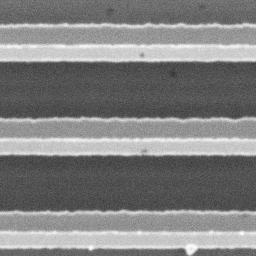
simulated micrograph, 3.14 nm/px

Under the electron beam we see lines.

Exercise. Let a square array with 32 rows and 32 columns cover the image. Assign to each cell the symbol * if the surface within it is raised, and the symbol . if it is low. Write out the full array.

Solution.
................................
................................
................................
********************************
********************************
********************************
********************************
***************************.****
................................
................................
................................
................................
................................
................................
................................
********************************
********************************
********************************
********************************
................................
................................
................................
................................
................................
................................
................................
..........*....*.**..****.*..*..
********************************
********************************
********************************
********************************
.......................*........